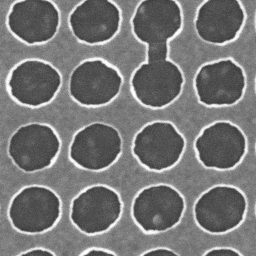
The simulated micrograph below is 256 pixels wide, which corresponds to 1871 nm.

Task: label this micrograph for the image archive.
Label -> a regular array of holes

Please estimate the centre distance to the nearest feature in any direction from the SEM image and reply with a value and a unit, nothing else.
452 nm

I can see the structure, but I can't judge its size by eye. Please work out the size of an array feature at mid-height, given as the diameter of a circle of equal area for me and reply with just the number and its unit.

347 nm